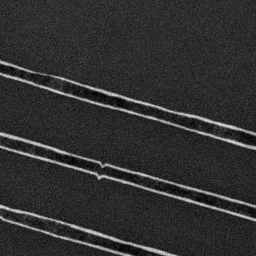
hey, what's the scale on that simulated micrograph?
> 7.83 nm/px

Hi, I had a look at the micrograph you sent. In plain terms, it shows one or a few lines or trenches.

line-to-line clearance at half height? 443 nm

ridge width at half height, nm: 104